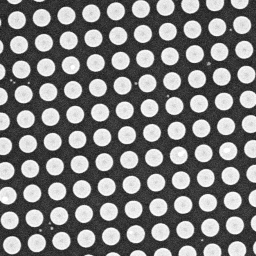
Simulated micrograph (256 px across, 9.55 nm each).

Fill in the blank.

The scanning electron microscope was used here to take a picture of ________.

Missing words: an array of small figures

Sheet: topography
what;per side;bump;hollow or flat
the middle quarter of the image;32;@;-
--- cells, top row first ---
@@@@--@@@@--@@@@---@@-----------
@@@@---@@-----------------------
--------------------------@@----
--------------@@---@@@@--@@@@--@
--@----@@@---@@@@--@@@@--@@@@--@
@@@@--@@@@@--@@@@--@@@@--@@@@---
@@@@--@@@@---@@@----@@----------
@@@@---@@@----@-----------------
--@------------------------@----
--------------------@@@---@@@---
--------@@---@@@@--@@@@---@@@@--
-@@@@--@@@@--@@@@--@@@@---@@@@--
-@@@@--@@@@--@@@@---@@@----@----
-@@@@--@@@@---@@----------------
--@@----------------------------
---------------------@@---@@@@--
--------@@@---@@@---@@@@--@@@@--
--@@@---@@@@--@@@@--@@@@--@@@@--
-@@@@--@@@@@--@@@@--@@@@---@@---
-@@@@---@@@---@@@---------------
--@@@---------------------------
----------------------@----@@@--
---------@@----@@@---@@@---@@@@-
--@@@---@@@@--@@@@--@@@@@--@@@@-
--@@@@--@@@@--@@@@---@@@---@@@--
--@@@@--@@@@---@@@----@---------
--@@@----@@---------------------
----------------------------@@@-
----------------@@---@@@@--@@@@-
---@@@---@@@---@@@@--@@@@--@@@@-
--@@@@---@@@@--@@@@--@@@@---@@@-
--@@@@@--@@@@--@@@@---@@--------